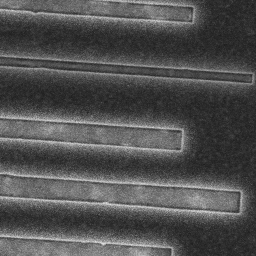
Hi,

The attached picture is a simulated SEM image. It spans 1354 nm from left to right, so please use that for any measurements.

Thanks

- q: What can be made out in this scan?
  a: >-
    one or a few lines or trenches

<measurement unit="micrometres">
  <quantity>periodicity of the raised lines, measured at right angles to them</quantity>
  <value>0.323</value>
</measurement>